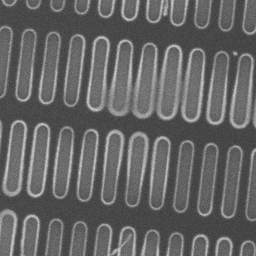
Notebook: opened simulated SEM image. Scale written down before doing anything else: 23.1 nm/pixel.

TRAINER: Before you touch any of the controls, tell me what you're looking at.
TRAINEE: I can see groups of lines, slits or small figures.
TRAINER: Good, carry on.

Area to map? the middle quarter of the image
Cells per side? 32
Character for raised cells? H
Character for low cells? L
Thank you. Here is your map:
HLLLHHHLLLLHHLLLLHHLLLLHHLLLLHHL
HLLLHHHLLLHHHLLLLHHLLLLHHLLLLHHL
HLLLHHHLLLHHHLLLLHHLLLLHHLLLLHHL
HLLLHHHLLLHHHLLLLHHLLLLHHLLLLHHL
LLLLHHHLLLHHLLLLHHLLLLLHHLLLLHHL
LLLLHHLLLLHHLLLLHHLLLLHHLLLLLHHL
LLLLHHLLLLHHLLLLHHLLLLHHLLLLLHLL
LLLLHHLLLLHHLLLLHHLLLLHHLLLLLHLL
LLLHHHLLLLHHLLLLHHLLLLHHLLLLHHLL
LLLHHHLLLLHHLLLLHHLLLLHHLLLLHHLL
HHHHHHLLLLHHLLLLHHLLLLHHLLLLHHLL
HHHHHHHHHHHHLLLHHHLLLLHHLLLLHHLL
HHHHHHHHHHHHHHHHHHLLLHHHLLLHHHLL
HHHHHHHHHHHHHHHHHHHHHHHHHLHHHHLL
HHHHHHHHHHHHHHHHHHHHHHHHHHHHHHHH
HHHHHHHHHHHHHHHHHHHHHHHHHHHHHHHH
LLHHHHHHHHHHHHHHHHHHHHHHHHHHHHHH
LLHHHLLLHHHHLLHHHHHHHHHHHHHHHHHH
LLHHHLLLHHHLLLHHHLLLHHHHLHHHHHHH
LLHHHLLLHHHLLLHHHLLLLHHLLLHHHHLH
LLHHHLLLHHHLLLHHHLLLLHHLLLHHHLLL
LLHHHLLLHHHLLLHHHLLLLHHLLLHHHLLL
LLHHLLLLHHHLLLHHLLLLHHHLLLHHHLLL
LLHHLLLLHHHLLLHHLLLLHHLLLLHHHLLL
LLHHLLLLHHLLLLHHLLLLHHLLLLHHHLLL
LLHHLLLHHHLLLLHHLLLLHHLLLLHHHLLL
LHHHLLLHHHLLLLHHLLLLHHLLLLHHLLLL
LHHHLLLHHHLLLHHHLLLLHHLLLLHHLLLL
LHHHLLLHHHLLLHHHLLLHHHLLLHHHLLLL
LHHHLLLHHHLLLHHHLLLHHHLLLHHHLLLH
LHHHLLLHHHLLLHHHLLLHHHLLLHHHLLLH
LHHHLLLHHHLLLHHHLLLHHHLLLHHHLLLH